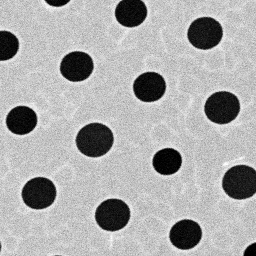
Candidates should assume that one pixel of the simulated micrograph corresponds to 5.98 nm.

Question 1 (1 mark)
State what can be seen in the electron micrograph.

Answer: a regular array of holes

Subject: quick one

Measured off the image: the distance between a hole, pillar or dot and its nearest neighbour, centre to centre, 451 nanometers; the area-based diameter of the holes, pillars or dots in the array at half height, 198 nm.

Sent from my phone